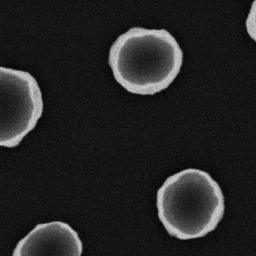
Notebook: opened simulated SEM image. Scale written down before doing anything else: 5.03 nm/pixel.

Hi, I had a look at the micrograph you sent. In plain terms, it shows raised bodies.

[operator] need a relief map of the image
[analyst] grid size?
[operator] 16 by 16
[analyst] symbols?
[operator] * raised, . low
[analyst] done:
................
................
........***.....
.......****.....
*......****.....
**......**......
**..............
**..............
*...............
................
................
..........***...
..........****..
..........****..
..***......**...
.****...........